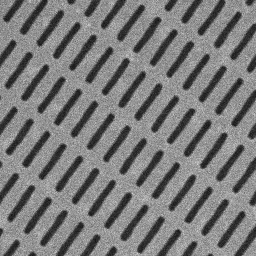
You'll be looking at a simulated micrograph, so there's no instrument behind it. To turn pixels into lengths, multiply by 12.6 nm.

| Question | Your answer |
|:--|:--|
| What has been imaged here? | a regular array of holes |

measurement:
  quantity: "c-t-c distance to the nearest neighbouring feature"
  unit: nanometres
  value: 258